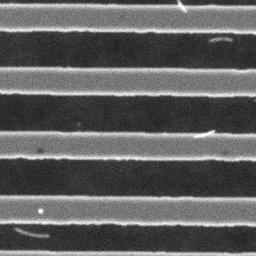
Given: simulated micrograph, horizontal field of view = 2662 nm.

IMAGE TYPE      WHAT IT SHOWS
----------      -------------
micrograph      lines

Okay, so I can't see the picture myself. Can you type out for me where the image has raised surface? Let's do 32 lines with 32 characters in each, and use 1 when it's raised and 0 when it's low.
00000000000000000000000000000000
11111111111111111111111111111111
11111111111111111111111111111111
11111111111111111111111111111111
00000000000000000000000000000000
00000000000000000000000000000000
00000000000000000000000000000000
00000000000000000000000000000000
11111111000000000000000000000000
11111111111111111111111111111111
11111111111111111111111111111111
11111111111111111111111111111111
00000000000000000000000000000000
00000000000000000000000000000000
00000000000000000000000000000000
00000000000000000000000000000000
00000000000000000000000000000000
11111111111111111111111111111111
11111111111111111111111111111111
11111111111111111111111111111111
00000000000000000000000000000000
00000000000000000000000000000000
00000000000000000000000000000000
00000000000000000000000000000000
00000000000000000000000000000000
11111111111111111111111111111111
11111111111111111111111111111111
11111111111111111111111111111111
00000000000000000000000000000000
00000000000000000000000000000000
00000000000000000000000000000000
11111000000000000000000000000000